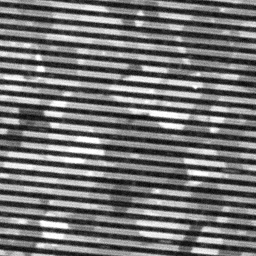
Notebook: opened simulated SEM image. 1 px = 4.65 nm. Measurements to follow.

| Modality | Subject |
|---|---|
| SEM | parallel lines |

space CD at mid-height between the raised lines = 31.8 nm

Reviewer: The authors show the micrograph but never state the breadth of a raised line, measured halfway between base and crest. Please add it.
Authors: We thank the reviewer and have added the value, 0.0202 um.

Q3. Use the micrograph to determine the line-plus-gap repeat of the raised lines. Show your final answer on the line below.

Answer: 51.1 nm